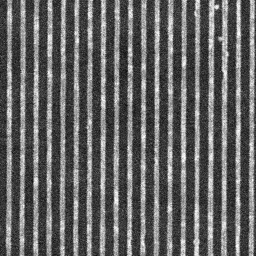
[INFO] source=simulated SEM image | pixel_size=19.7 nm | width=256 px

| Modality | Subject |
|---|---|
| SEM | parallel lines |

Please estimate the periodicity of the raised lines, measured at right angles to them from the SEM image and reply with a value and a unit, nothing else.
265 nm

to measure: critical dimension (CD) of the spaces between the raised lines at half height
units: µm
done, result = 0.19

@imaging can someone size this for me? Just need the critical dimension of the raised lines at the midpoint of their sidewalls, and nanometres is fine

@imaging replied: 76.3